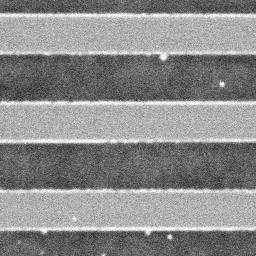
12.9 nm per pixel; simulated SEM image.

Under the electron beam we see lines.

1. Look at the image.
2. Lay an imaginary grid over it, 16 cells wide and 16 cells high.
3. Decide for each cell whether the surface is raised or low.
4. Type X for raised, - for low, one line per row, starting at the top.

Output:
----------------
XXXXXXXXXXXXXXXX
XXXXXXXXXXXXXXXX
----------------
----------------
----------------
XXXXXXXXXXXXXXXX
XXXXXXXXXXXXXXXX
XXXXXXXXXXXXXXXX
----------------
----------------
----------------
XXXXXXXXXXXXXXXX
XXXXXXXXXXXXXXXX
----------------
----------------